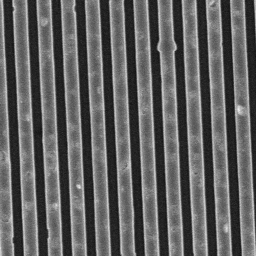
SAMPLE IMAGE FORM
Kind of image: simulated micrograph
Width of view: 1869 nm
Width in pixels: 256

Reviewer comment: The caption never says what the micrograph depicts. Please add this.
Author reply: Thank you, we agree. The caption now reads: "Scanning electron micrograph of parallel lines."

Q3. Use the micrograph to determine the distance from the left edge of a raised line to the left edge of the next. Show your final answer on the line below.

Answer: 176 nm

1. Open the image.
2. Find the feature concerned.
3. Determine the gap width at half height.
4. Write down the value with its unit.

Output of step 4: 77.5 nm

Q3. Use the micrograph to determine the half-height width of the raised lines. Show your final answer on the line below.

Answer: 97.5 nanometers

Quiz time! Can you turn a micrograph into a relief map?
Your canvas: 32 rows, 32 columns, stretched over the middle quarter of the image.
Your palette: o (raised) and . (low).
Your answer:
ooo...ooo...ooo...oooo..oooo..oo
ooo...ooo...ooo...oooo..oooo..oo
ooo...ooo...ooo...oooo..oooo..oo
oooo..oooo..oooo..oooo..oooo..oo
oooo..oooo..oooo..oooo...ooo..oo
oooo..oooo..oooo..oooo...ooo...o
.ooo..oooo...ooo...ooo...ooo...o
oooo..oooo...ooo...ooo...ooo...o
oooo..oooo...ooo...ooo...ooo...o
oooo...ooo...ooo...ooo...ooo...o
.ooo...ooo...ooo...ooo...ooo...o
.ooo...ooo...ooo...ooo...ooo...o
.ooo...ooo...ooo...ooo...ooo...o
.ooo...ooo...ooo...ooo...ooo...o
.ooo...ooo...ooo...ooo...ooo...o
.ooo...ooo...ooo...ooo...ooo...o
.ooo...ooo...ooo...ooo...ooo...o
.ooo...ooo...ooo...ooo...ooo...o
.ooo...ooo...ooo...ooo...ooo...o
.ooo...ooo...ooo...ooo...ooo...o
.ooo...ooo...ooo...ooo...oooo..o
.ooo...ooo...ooo...ooo...oooo..o
.ooo...ooo...ooo...ooo...oooo..o
.ooo...ooo...ooo...oooo..oooo..o
.ooo...ooo...ooo...oooo..oooo..o
.oooo..oooo..oooo..oooo..oooo..o
.oooo..oooo..oooo..oooo..oooo..o
.oooo..oooo..oooo..oooo...ooo...
..ooo...ooo...ooo...ooo...ooo...
..ooo...ooo...ooo...ooo...ooo...
..ooo...ooo...ooo...ooo...ooo...
..ooo...ooo...ooo...ooo...ooo...